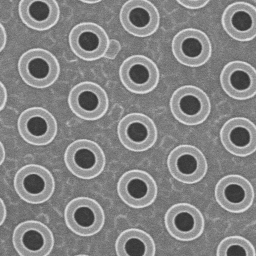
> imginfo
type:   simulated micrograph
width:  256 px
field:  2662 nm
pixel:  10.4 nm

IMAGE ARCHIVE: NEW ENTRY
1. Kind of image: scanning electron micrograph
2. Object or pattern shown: a regular array of ring-shaped raised bodies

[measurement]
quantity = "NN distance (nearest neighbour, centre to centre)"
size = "0.593 microns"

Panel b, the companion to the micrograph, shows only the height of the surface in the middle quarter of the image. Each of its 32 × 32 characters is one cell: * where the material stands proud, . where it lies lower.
..............***...***.........
..............**.....***........
..............**.....***........
..............***....***........
...............**...***.........
...******......********.........
..********......******......****
.***....**.................*****
.**.....***................**...
.**......**................**...
.***....***................**...
..***...***................**...
...*******.......**........***..
.....***.......******.......****
..............********.......***
..............**....***.........
..............**.....**.........
..............**.....**.........
..............**.....**.........
...****.......****.****.........
.********......*******.......***
.***...**........***.......*****
***....***.................*****
***.....**................***...
***.....**................**....
.***...***................**....
.********.................***...
..*******......******......***..
....**........********......****
..............**....***.......**
..............**.....**.........
.............***.....**.........